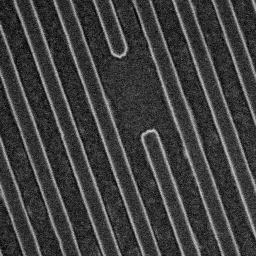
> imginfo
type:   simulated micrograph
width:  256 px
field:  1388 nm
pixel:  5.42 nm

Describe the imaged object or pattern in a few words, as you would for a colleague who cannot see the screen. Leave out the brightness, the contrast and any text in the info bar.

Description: parallel lines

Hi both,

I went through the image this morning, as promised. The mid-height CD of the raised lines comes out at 88.9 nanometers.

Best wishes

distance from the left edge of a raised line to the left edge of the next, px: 37.5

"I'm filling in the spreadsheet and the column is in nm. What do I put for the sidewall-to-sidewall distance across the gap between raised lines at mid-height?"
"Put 114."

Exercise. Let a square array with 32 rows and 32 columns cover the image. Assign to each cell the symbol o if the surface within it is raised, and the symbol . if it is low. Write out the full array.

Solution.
..oo...oo...oo...oo...oo...oo...
..oo...oo...oo...oo...oo...oo...
...oo...oo..ooo...oo..ooo..ooo..
...oo...oo...oo...oo...oo...oo..
o..ooo..ooo..oo...oo...oo...oo..
o...oo...oo...oo...oo...oo..ooo.
o...oo...oo...oo...oo...oo...oo.
oo..ooo..ooo.......oo...oo...oo.
oo...oo...oo........oo...oo...oo
oo...oo...oo........oo...oo...oo
ooo..ooo..ooo.......oo...oo...oo
.oo...oo...oo........oo...oo...o
.oo...oo...oo........oo...oo...o
.ooo..ooo..ooo.......ooo..oo...o
..oo...oo...oo........oo...oo...
..oo...oo...oo........oo...oo...
...oo...oo..ooo...o...ooo..ooo..
...oo...oo...oo...oo...oo...oo..
...oo...oo...oo...oo...oo...oo..
o...oo...oo...oo..ooo..ooo..ooo.
o...oo...oo...oo...oo...oo...oo.
o...oo...oo...oo...oo...oo...oo.
oo...oo...oo...oo...oo...oo..ooo
oo...oo...oo...oo...oo...oo...oo
ooo..ooo..ooo..ooo..oo...oo...oo
.oo...oo...oo...oo...oo...oo...o
.oo...oo...oo...oo...oo...oo...o
.ooo..ooo..ooo..ooo..oo...oo...o
..oo...oo...oo...oo...oo...oo...
..oo...oo...oo...oo...oo...oo...
..ooo..ooo..ooo..ooo..ooo..oo...
...oo...oo...oo...oo...oo...oo..